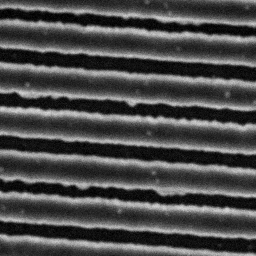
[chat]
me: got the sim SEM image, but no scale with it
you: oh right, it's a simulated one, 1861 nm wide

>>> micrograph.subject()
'lines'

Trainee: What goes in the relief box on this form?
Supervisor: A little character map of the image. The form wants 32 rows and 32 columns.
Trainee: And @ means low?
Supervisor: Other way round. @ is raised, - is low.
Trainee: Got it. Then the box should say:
@@@@@@@@@@@@@@@@@@@@@@@@@@@@@@@@
-----------@@@@@@@@@@@@@@@@@@@@@
---------------------@@@@@@@@@@@
@@@@@@@@@@@@--------------------
@@@@@@@@@@@@@@@@@@@@@@@@@@------
@@@@@@@@@@@@@@@@@@@@@@@@@@@@@@@@
-------@@@@@@@@@@@@@@@@@@@@@@@@@
---------------------@@@@@@@@@@@
@@@@@@--------------------------
@@@@@@@@@@@@@@@@@@@-------------
@@@@@@@@@@@@@@@@@@@@@@@@@@@@@@@@
@@@@@@@@@@@@@@@@@@@@@@@@@@@@@@@@
---------------@@@@@@@@@@@@@@@@@
---------------------------@@@@@
@@@@@@@@@@@@@-------------------
@@@@@@@@@@@@@@@@@@@@@@@@@@@@----
@@@@@@@@@@@@@@@@@@@@@@@@@@@@@@@@
--------@-@@@@@@@@@@@@@@@@@@@@@@
----------------------@@@@@@@@@@
@@@@@@@-------------------------
@@@@@@@@@@@@@@@@@@@@@-----------
@@@@@@@@@@@@@@@@@@@@@@@@@@@@@@@@
---@@@@@@@@@@@@@@@@@@@@@@@@@@@@@
-----------------@@@@@@@@@@@@@@@
@@@@@@------------------------@@
@@@@@@@@@@@@@@@@@---------------
@@@@@@@@@@@@@@@@@@@@@@@@@@@@@@@-
@@@@@@@@@@@@@@@@@@@@@@@@@@@@@@@@
--------------@@@@@@@@@@@@@@@@@@
---------------------------@@@@@
@@@@@@@@@@@@@-------------------
@@@@@@@@@@@@@@@@@@@@@@@@@@------